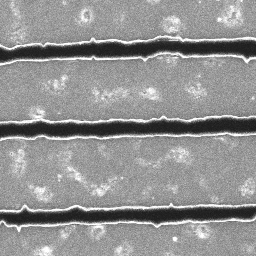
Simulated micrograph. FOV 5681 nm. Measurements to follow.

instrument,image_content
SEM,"one or a few lines or trenches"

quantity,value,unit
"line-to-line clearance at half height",1.47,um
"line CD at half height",377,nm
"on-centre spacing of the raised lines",82.8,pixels